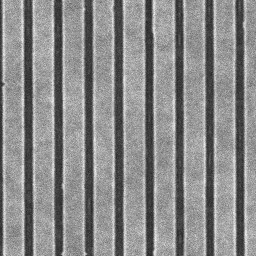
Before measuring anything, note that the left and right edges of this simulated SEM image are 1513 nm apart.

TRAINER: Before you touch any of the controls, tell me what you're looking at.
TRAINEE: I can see parallel lines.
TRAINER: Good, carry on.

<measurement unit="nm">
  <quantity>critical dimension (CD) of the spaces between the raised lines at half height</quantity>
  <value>46.5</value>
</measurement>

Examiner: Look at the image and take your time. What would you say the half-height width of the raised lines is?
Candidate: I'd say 128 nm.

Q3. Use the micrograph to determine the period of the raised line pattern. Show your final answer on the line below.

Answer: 0.178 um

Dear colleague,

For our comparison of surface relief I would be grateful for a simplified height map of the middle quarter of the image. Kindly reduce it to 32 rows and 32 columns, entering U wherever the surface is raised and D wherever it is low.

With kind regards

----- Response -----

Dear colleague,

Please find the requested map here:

UUUUUDDUUUUUUDDUUUUUDDUUUUUUDDUU
UUUUUDDUUUUUUDDUUUUUDDUUUUUUDDUU
UUUUUDDUUUUUUDDUUUUUDDUUUUUUDDUU
UUUUUDDUUUUUUDDUUUUUDDUUUUUUDDUU
UUUUUDDUUUUUUDDUUUUUDDUUUUUUDDUU
UUUUUDDUUUUUUDDUUUUUDDUUUUUUDDUU
UUUUUDDUUUUUUDDUUUUUDDUUUUUUDDUU
UUUUUDDUUUUUDDDUUUUUDDUUUUUUDDUU
UUUUUDDUUUUUUDDUUUUUDDUUUUUUDDUU
UUUUUDDUUUUUUDDUUUUUDDUUUUUUDDUU
UUUUUDDUUUUUUDDUUUUUDDUUUUUUDDUU
UUUUUDDUUUUUDDDUUUUUDDUUUUUUDDUU
UUUUUDDUUUUUDDDUUUUUDDUUUUUUDDUU
UUUUUDDUUUUUUDDUUUUUDDUUUUUUDDUU
UUUUUDDUUUUUUDDUUUUUDDUUUUUUDDUU
UUUUUDDUUUUUUDDUUUUUDDUUUUUUDDUU
UUUUUDDUUUUUUDDUUUUUDDUUUUUUDDUU
UUUUUDDUUUUUUDDUUUUUDDUUUUUUDDUU
UUUUUDDUUUUUUDDUUUUUDDUUUUUUDDUU
UUUUUDDUUUUUUDDUUUUUDDUUUUUUDDUU
UUUUUDDUUUUUUDDUUUUUDDUUUUUUDDUU
UUUUUDDUUUUUUDDUUUUUDDUUUUUUDDUU
UUUUUDDUUUUUUDDUUUUUDDDUUUUUDDUU
UUUUUDDUUUUUUDDUUUUUDDDUUUUUDDUU
UUUUUDDUUUUUUDDUUUUUDDDUUUUUDDUU
UUUUUDDUUUUUUDDUUUUUDDDUUUUUDDUU
UUUUUDDUUUUUUDDUUUUUDDDUUUUUDDUU
UUUUUDDUUUUUUDDUUUUUDDDUUUUUDDUU
UUUUUDDUUUUUUDDUUUUUDDDUUUUUDDUU
UUUUUDDUUUUUUDDUUUUUDDUUUUUUDDUU
UUUUUDDUUUUUUDDUUUUUDDUUUUUUDDUU
UUUUUDDUUUUUUDDUUUUUDDUUUUUUDDUU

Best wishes